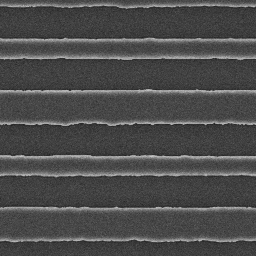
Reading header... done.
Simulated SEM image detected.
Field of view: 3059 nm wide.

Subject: lines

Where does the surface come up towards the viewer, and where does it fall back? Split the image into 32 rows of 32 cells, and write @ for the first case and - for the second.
@@@@@@@@@@@@@@@@@@@@@@@@@@@@@@@@
--------------------------------
--------------------------------
--------------------------------
--------------------------------
@@@@@@@@@@@@@@@@@@@@@@@@@@@@@@@@
@@@@@@@@@@@@@@@@@@@@@@@@@@@@@@@@
--------------------------------
--------------------------------
--------------------------------
--------------------------------
@@@@@@@@@@@@@@@@@@@@@@@@@@@@@@@@
@@@@@@@@@@@@@@@@@@@@@@@@@@@@@@@@
@@@@@@@@@@@@@@@@@@@@@@@@@@@@@@@@
@@@@@@@@@@@@@@@@@@@@@@@@@@@@@@@@
@@-@@@@@@@---@@@@-@@-@@--@-@-@@@
--------------------------------
--------------------------------
--------------------------------
@@@---@@@@@@----@-@@--@@--------
@@@@@@@@@@@@@@@@@@@@@@@@@@@@@@@@
@@@@@@@@@@@@@@@@@@@@@@@@@@@@@@@@
--------------------------------
--------------------------------
--------------------------------
--------------------------------
@@@@@@@@@@@@@@@@@@@@@@@@@@@@@@@@
@@@@@@@@@@@@@@@@@@@@@@@@@@@@@@@@
@@@@@@@@@@@@@@@@@@@@@@@@@@@@@@@@
@@@@@@@@@@@@@@@@@@@@@@@@@@@@@@@@
--------------------------------
--------------------------------